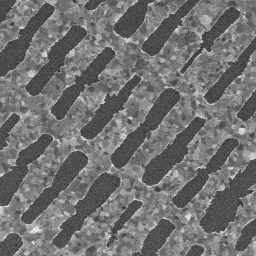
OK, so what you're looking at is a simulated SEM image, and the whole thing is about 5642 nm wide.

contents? a regular array of holes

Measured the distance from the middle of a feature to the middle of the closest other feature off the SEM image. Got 828 nm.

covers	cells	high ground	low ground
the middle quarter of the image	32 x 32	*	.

******.....*******************..
*****.....****.**************..*
****.....***********************
***......********..*************
***.....*****.**...*************
**...**********...**************
.....*********...********...****
....********.....*******.....***
....******......*******......***
...*******......*******......***
..*******......*******......****
.*******.......******......*****
.*******.....********.....******
*******.....********.....*******
******.....*********.....*******
*****......*****.**.....*******.
****......********.....*******..
****.....*******.....*******....
*****...*******.....********....
***************.....*******.....
**************.....*******.....*
*************.....*******......*
*....*******......******.......*
*.....******.....*****........**
......**.***....*****.........**
......******...*****........****
....*********.******.......*****
....*****...**.*****......******
...*****......*****......*******
..*****.......******....*******.
.******.......*******.********..
******.......****************...